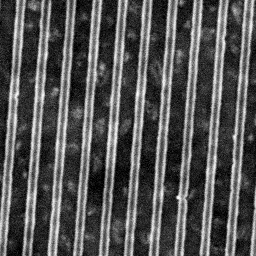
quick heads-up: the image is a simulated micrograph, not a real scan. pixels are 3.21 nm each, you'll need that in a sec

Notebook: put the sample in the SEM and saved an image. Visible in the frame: parallel lines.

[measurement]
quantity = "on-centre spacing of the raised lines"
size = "0.0811 microns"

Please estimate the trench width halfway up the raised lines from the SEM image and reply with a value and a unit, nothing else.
54 nm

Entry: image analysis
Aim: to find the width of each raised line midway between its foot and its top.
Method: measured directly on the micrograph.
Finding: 25.6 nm